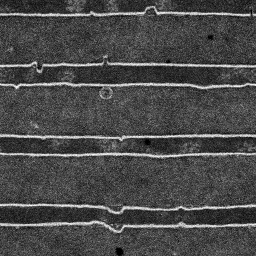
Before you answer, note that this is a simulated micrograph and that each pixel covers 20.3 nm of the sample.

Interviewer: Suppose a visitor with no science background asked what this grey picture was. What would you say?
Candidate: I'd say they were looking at one or a few lines or trenches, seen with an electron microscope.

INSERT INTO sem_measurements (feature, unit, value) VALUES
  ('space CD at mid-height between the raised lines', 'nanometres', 1040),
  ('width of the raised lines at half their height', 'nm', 375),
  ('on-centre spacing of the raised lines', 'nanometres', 1430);